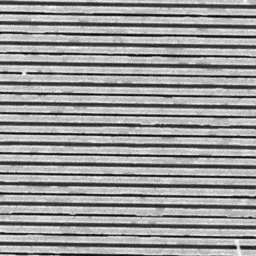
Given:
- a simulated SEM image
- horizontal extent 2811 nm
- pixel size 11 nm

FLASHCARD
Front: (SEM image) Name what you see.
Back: parallel lines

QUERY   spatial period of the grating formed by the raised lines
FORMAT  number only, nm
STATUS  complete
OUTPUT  110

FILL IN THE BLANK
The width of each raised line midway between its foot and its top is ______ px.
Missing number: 6.75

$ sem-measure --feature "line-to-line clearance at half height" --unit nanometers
41.2